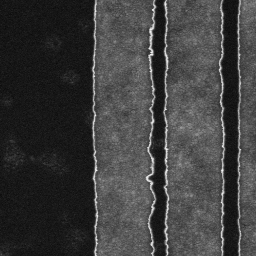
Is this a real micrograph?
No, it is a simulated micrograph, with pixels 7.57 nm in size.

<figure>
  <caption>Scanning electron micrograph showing one or a few lines or trenches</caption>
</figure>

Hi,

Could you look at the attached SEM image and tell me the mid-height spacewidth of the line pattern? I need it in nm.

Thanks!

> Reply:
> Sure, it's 425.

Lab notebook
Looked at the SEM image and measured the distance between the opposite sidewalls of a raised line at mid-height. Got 123 nanometres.